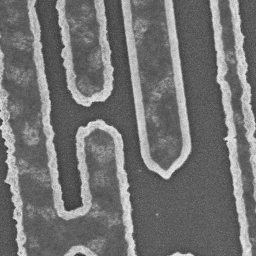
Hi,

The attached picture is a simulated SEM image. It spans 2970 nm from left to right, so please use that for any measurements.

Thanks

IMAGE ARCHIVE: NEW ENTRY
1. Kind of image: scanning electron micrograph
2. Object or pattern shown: one or a few lines or trenches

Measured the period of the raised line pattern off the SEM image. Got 808 nm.